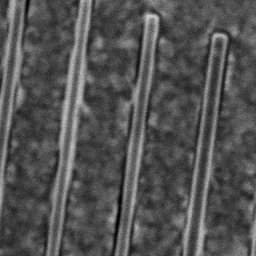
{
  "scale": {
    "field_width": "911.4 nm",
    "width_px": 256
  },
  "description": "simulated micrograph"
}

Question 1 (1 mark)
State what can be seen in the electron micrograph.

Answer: one or a few lines or trenches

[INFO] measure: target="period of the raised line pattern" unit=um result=0.243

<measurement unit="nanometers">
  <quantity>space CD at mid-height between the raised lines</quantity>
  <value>203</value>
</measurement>